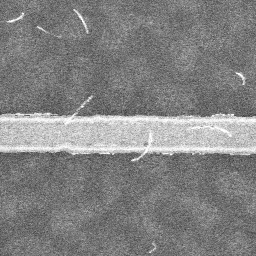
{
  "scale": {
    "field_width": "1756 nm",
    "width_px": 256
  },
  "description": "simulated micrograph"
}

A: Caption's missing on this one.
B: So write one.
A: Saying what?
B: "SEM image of one or a few lines or trenches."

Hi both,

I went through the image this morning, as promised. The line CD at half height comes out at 29.2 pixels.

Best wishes